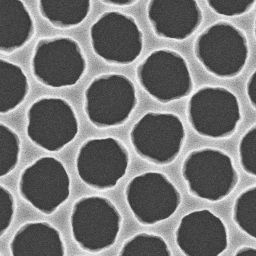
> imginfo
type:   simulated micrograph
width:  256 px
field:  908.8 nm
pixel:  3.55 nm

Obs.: a regular array of holes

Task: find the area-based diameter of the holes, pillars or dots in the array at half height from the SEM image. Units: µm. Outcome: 0.18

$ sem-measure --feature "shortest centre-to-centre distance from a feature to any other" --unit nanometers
216